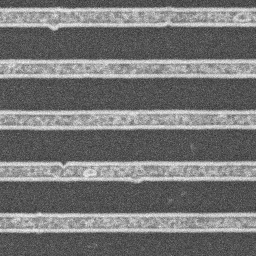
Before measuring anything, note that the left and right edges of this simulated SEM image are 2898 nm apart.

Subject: parallel lines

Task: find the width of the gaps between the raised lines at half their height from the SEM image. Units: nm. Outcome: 409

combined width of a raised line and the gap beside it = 0.582 microns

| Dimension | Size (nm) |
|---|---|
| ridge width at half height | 174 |